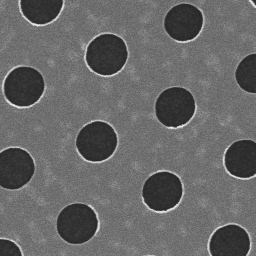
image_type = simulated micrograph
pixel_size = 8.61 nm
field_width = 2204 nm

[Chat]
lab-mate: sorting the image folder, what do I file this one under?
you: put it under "holes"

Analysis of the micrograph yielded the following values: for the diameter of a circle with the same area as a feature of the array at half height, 346 nm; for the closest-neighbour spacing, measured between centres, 0.716 µm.